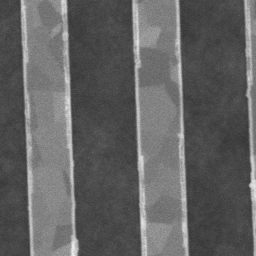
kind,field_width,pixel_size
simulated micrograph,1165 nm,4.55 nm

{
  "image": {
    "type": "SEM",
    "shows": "one or a few lines or trenches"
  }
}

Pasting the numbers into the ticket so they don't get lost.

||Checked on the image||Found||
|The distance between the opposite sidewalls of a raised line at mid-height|199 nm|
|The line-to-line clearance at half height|67.4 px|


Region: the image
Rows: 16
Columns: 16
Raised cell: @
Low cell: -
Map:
-@@@----@@@----@
-@@@----@@@----@
-@@@----@@@----@
--@@----@@@----@
--@@-----@@----@
--@@-----@@-----
--@@-----@@-----
--@@-----@@-----
--@@-----@@-----
--@@-----@@-----
--@@-----@@-----
--@@@----@@@----
--@@@----@@@----
--@@@----@@@----
--@@@----@@@----
--@@@----@@@----